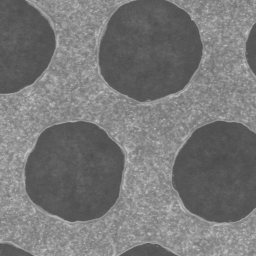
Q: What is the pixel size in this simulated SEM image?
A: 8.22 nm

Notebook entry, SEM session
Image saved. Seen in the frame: holes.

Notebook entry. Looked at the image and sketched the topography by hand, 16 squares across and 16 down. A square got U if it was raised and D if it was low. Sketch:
DDUUUUUDDDDUUUUU
DDDUUUUDDDDDUUUU
DDDUUUDDDDDDDUUD
DDDUUUDDDDDDDUUD
DDDUUUDDDDDDUUUU
DDUUUUUDDDDUUUUU
UUUUUUUUUUUUUUUU
UUUUUUUUUUUUUUUU
UUDDDDDUUUUUDDDD
UUDDDDDDUUUDDDDD
UUDDDDDDUUUDDDDD
UUDDDDDDUUUDDDDD
UUDDDDDUUUUDDDDD
UUUDDDUUUUUUDDDU
UUUUUUUUUUUUUUUU
DUUUUUUUDDUUUUUU